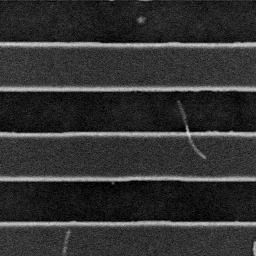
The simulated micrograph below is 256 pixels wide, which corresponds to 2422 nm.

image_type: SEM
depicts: lines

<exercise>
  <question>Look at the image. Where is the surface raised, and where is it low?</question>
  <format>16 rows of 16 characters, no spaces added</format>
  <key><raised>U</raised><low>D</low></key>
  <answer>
DDDDDDDDDDDDDDDD
DDDDDDDDDDDDDDDD
DDDDDDDDDDDDDDDD
UUUUUUUUUUUUUUUU
UUUUUUUUUUUUUUUU
UUUUUUUUUUUUUUUU
DDDDDDDDDDDDDDDD
DDDDDDDDDDDDDDDD
UUUUUUUUUUUUUUUU
UUUUUUUUUUUUUUUU
UUUUUUUUUUUUUUUU
DDDDDDDDDDDDDDDD
DDDDDDDDDDDDDDDD
DDDDDDDDDDDDDDDD
UUUUUUUUUUUUUUUU
UUUUUUUUUUUUUUUU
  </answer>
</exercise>